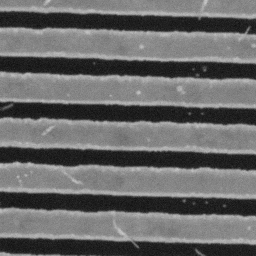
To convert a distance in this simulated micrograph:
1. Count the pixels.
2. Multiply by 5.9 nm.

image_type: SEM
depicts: lines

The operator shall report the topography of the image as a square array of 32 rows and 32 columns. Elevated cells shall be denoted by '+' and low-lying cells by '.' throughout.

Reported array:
++++++++++++++++++++++++++++++++
.............+++++++++++++++++++
................................
................................
++++++++++++++++++++++++++++++++
++++++++++++++++++++++++++++++++
++++++++++++++++++++++++++++++++
....................++++...+++++
................................
++++++++........................
++++++++++++++++++++++++++++++++
++++++++++++++++++++++++++++++++
++++++++++++++++++++++++++++++++
................................
................................
++++++++++++++++.++.++..........
++++++++++++++++++++++++++++++++
++++++++++++++++++++++++++++++++
............++++++++++++++++++++
................................
..++............................
+++++++++++++++++++++++++++++++.
++++++++++++++++++++++++++++++++
++++++++++++++++++++++++++++++++
............................++++
................................
++++++.+........................
++++++++++++++++++++++++++++++++
++++++++++++++++++++++++++++++++
..++++++++++++++++++++++++++++++
................................
................................